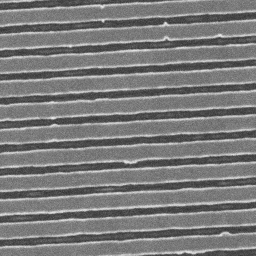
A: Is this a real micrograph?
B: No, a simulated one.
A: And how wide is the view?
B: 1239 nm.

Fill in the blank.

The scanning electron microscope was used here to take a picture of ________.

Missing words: parallel lines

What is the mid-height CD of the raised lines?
0.0731 micrometres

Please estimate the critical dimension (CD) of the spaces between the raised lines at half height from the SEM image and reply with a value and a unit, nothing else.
41.1 nanometers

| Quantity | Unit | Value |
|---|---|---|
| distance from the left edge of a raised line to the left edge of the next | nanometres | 114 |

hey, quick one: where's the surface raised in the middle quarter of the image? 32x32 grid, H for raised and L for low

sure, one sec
HHHHHHHHHHHHHHHHHLLLLLLLLLLLLLLL
LLLLLLLLLLLLLLLLLLLLLLLLLLLLLLLL
LLLLLLLLLLLLLLLLLLLHHHHHHHHHHHHH
LHHHHHHHHHHHHHHHHHHHHHHHHHHHHHHH
HHHHHHHHHHHHHHHHHHHHHHHHHHHHHHHH
HHHHHHHHHHHHHHHHHHHHHHHHHHHHHHLH
HHHHHHHHHHHLLLLLLLLLLLLLLLLLLLLL
LLLLLLLLLLLLLLLLLLLLLLLLLLLLLLLL
LLLLLLLLLLLLLLLLLHHHHHHHHHHHHHHH
LHHHHHHHHHHHHHHHHHHHHHHHHHHHHHHH
HHHHHHHHHHHHHHHHHHHHHHHHHHHHHHHH
HHHHHHHHHHHHHHHHHHHHHHHHHHHLLLHL
HHHHHHHHHHHHHLLLLLLLLLLLLLLLLLLL
LLLLLLLLLLLLLLLLLLLLLLLLLLLLLLLL
LLLLLLLLLLLLLLLLHHHHHHHHHHHHHHHH
HHHHHHHHHHHHHHHHHHHHHHHHHHHHHHHH
HHHHHHHHHHHHHHHHHHHHHHHHHHHHHHHH
HHHHHHHHHHHHHHHHHHHHHHHHHHHLLLLL
HHHHHHHHHHLHLLLLLLLLLLLLLLLLLLLL
LLLLLLLLLLLLLLLLLLLLLLLLLLLLLLLL
LLLLLLLLLLLLLLHLLHHHHHHHHHHHHHHH
HHHHHHHHHHHHHHHHHHHHHHHHHHHHHHHH
HHHHHHHHHHHHHHHHHHHHHHHHHHHHHHHH
HHHHHHHHHHHHHHHHHHHHHHHHHHHHLLLL
HHHHHHHLLLLLLLLHHHLLLLLLLLLLLLLL
LLLLLLLLLLLLLLLLLLLLLLLLLLLLLLHH
LLLLLLLLLLLLLHHHHHHHHHHHHHHHHHHH
HHHHHHHHHHHHHHHHHHHHHHHHHHHHHHHH
HHHHHHHHHHHHHHHHHHHHHHHHHHHHHHHH
HHHHHHHHHHHHHHHHHHHHHHHHHHLLLLLL
HHHHHLLHHLLLLLLLLLLLLLLLLLLLLLLL
LLLLLLLLLLLLLLLLLLLLLLLLLLLLLHHH